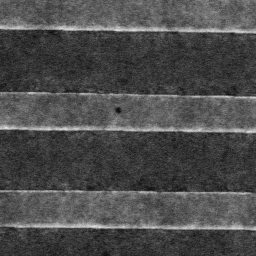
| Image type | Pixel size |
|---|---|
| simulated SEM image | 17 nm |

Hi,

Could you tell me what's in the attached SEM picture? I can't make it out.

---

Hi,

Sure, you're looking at lines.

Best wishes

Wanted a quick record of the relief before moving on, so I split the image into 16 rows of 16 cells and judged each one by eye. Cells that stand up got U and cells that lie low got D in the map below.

UUUUUUUUUUUUUUUU
UUUUUUUUUUUUUUUU
DDDDDDDDDDDDDDDD
DDDDDDDDDDDDDDDD
DDDDDDDDDDDDDDDD
DDDDDDDDDDDDDDDD
UUUUUUUUUUUUUUUU
UUUUUUUUUUUUUUUU
DDDDDDDDDDDDDDDD
DDDDDDDDDDDDDDDD
DDDDDDDDDDDDDDDD
DDDDDDDDDDDDDDDD
UUUUUUUUUUUUUUUU
UUUUUUUUUUUUUUUU
DDDDDDDDDDDDDDDD
DDDDDDDDDDDDDDDD